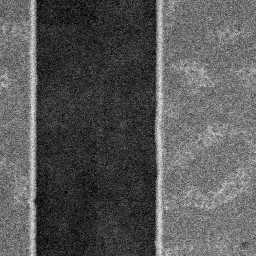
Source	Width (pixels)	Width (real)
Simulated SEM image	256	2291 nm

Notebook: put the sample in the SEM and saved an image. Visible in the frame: one or a few lines or trenches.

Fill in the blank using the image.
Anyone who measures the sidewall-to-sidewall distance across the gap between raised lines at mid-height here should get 1140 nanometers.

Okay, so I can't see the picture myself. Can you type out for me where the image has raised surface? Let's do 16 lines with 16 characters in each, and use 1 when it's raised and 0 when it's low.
1100000000111111
1100000000111111
1100000000111111
1100000000111111
1100000000111111
1100000000111111
1100000000111111
1100000000111111
1100000000111111
1100000000111111
1100000000111111
1100000000111111
1100000000111111
1100000000111111
1100000000111111
1100000000111111